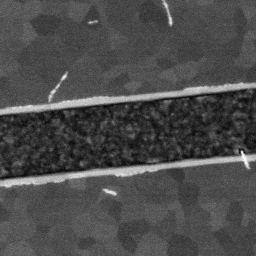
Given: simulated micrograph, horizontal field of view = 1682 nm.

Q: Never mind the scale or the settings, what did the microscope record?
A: one or a few lines or trenches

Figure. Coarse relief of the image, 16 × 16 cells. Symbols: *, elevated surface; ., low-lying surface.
****************
****************
****************
****************
****************
**************..
*****...........
................
................
................
.........*******
****************
****************
****************
****************
****************